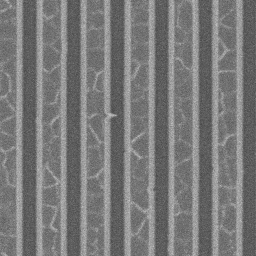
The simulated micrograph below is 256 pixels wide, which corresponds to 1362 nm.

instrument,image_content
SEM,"parallel lines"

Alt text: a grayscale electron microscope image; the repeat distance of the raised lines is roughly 44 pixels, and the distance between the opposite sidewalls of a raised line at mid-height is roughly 134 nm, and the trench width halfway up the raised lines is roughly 0.102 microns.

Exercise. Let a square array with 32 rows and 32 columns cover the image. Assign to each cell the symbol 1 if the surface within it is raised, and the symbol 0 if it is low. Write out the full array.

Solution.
11000111000110001110011100011100
11000111000110001110011100011100
11000111000110001110011100011100
11000111000110001110011100011100
11000111000110001110011100011100
11000111001110001110011100011100
11000111001110001110011100011100
11000111001110001110011100011100
11000111001110001110011100011100
11000111001110001110011100011100
11000111001110001110011100011100
11000111001110001110011100011100
11000111001110001110011100011100
11000111001110001110011100011100
11000111001111001110011100011100
11000111001110001110011100011100
11000111001110001110011100011100
11000111001110001110011100011100
11000111001110001110011100011100
11000111001110001110011100011100
11000111001110001110011100011100
11000111001110001110011100011100
11000111001110001110011100011100
11000111001110001110011100011100
11000111001110001110011100011100
11000111001110001110011100011100
11000111001110001110011100011100
11000111001110001110011100011100
11000111001110001110011100011100
11000111001110001110011100011100
11000111001110001110011100011100
11000111001110001110011100011100